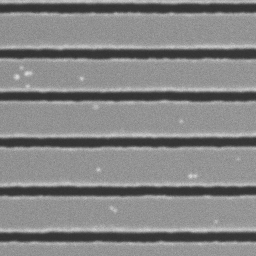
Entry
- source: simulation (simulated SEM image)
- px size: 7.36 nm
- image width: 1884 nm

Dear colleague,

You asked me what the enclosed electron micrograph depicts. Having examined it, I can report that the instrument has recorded lines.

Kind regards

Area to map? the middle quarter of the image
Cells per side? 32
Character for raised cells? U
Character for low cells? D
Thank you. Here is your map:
UUUUUUUUUUUUUUUUUUUUUUUUUUUUUUUU
UUUUUUUUUUUUUUUUUUUUUUUUUUUUUUUU
UUUUUUUUUUUUUUUUUUUUUUUUUUUUUUUU
UUUUUUUUUUUUUUUUUUUUUUUUUUUUUUUU
UUUUUUUUUUUUUUUUUUUUUUUUUUUUUUUU
UUUUUUUUUUUUUUUUUUUUUUUUUUUUUUUU
UUUUUUUUUUUUUUUUUUUUUUUUUUUUUUUU
DDDDDDDDDDDDDDDDDDDDDDDDDDDDDDDD
DDDDDDDDDDDDDDDDDDDDDDDDDDDDDDDD
UUUDUUUUUUUUUUUUUUUUUUUUUUUUUUUU
UUUUUUUUUUUUUUUUUUUUUUUUUUUUUUUU
UUUUUUUUUUUUUUUUUUUUUUUUUUUUUUUU
UUUUUUUUUUUUUUUUUUUUUUUUUUUUUUUU
UUUUUUUUUUUUUUUUUUUUUUUUUUUUUUUU
UUUUUUUUUUUUUUUUUUUUUUUUUUUUUUUU
UUUUUUUUUUUUUUUUUUUUUUUUUUUUUUUU
UUUUUUUUUUUUUUUUUUUUUUUUUUUUUUUU
UUUUUUUUUUUUUUUUUUUUUUUUUUUUUUUU
DDDDDDDDDDUDDDDDDDDDDDDDDDDDDDDD
DDDDDDDDDDDDDDDDDDDDDDDDDDDDDDDD
DDDDDDDDDDDDDDDDDDDDDDDDDDDDDDDD
UUUUUUUUUUUUUUUUUUUUUUUUUUUUUUUU
UUUUUUUUUUUUUUUUUUUUUUUUUUUUUUUU
UUUUUUUUUUUUUUUUUUUUUUUUUUUUUUUU
UUUUUUUUUUUUUUUUUUUUUUUUUUUUUUUU
UUUUUUUUUUUUUUUUUUUUUUUUUUUUUUUU
UUUUUUUUUUUUUUUUUUUUUUUUUUUUUUUU
UUUUUUUUUUUUUUUUUUUUUUUUUUUUUUUU
UUUUUUUUUUUUUUUUUUUUUUUUUUUUUUUU
UUUUUUUUUUUUUUUUUUUUUUUUUUUUUUUU
DDUUUUUUDDUDUUUUUUUDDDUUUDUUUDDU
DDDDDDDDDDDDDDDDDDDDDDDDDDDDDDDD